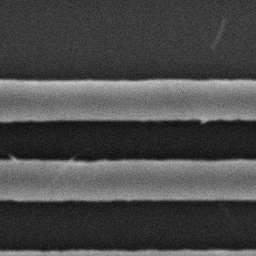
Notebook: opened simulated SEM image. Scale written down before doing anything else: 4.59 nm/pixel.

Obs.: lines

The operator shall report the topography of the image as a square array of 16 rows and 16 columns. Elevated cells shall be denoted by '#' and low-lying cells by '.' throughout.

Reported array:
................
................
................
................
................
################
################
####....##..#...
................
................
################
################
#######.##...#..
................
................
................